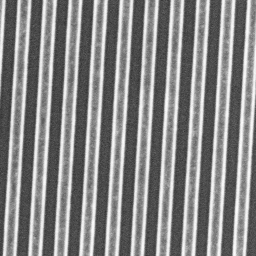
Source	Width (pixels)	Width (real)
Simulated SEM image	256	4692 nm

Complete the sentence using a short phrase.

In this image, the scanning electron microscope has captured parallel lines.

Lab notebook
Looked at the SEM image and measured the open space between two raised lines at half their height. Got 265 nm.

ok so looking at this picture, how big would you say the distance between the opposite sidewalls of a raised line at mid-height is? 213 nanometres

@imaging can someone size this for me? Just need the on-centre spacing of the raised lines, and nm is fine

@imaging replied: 467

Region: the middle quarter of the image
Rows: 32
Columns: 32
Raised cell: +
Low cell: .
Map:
.++....++....+++....++....+++...
.++....++....+++....++....+++...
.++....+++...+++....++....+++...
.++....+++...+++....++....+++...
+++....++....+++....++....+++...
+++....++....+++....++....+++...
+++....++....+++...+++....++....
+++....++....+++...+++....++....
+++....++....+++...+++....++....
+++...+++....++....+++....++....
+++...+++....++....+++....++....
+++...+++....++....+++...+++....
++....+++....++....+++...+++....
++....+++....++....+++...+++....
++....+++...+++....++....+++....
++....+++...+++....++....+++....
++....+++....++....++....+++...+
++....++.....++....++....+++...+
++....+++...+++....++....+++...+
++....+++...+++....++....+++...+
++....++....+++....++....+++...+
++....++....+++....++....+++...+
++....++....+++....++....+++...+
++....++....+++...+++....++....+
++....++....+++...+++....++....+
++....++....+++...+++....++....+
++...+++....++....+++....++....+
++...+++....++....+++....++....+
++...+++....++....+++...+++....+
+....+++....++....+++...+++....+
+....+++....++....+++...+++....+
+....+++...+++....++....+++....+